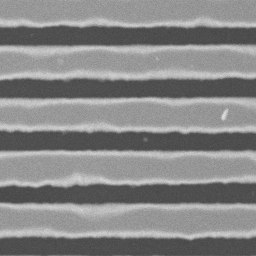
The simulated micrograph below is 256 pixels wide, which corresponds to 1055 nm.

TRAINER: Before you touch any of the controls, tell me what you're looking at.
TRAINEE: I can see lines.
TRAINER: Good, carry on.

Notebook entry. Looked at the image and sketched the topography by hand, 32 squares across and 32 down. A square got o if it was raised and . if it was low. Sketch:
oooooooooooooooooooooooooooooooo
oooooooooooooooooooooooooooooooo
oooooooooooooooooooooooooooooooo
................................
................................
................................
oooooooooooooooooooooooooooooooo
oooooooooooooooooooooooooooooooo
oooooooooooooooooooooooooooooooo
oooooooooooooooooooooooooooooooo
................................
................................
oooooooooooooooooooooooooooooooo
oooooooooooooooooooooooooooooooo
oooooooooooooooooooooooooooooooo
oooooooooooooooooooooooooooooooo
...................oo.oo.oooo.oo
................................
................................
oooooooooooooooooooooooooooooooo
oooooooooooooooooooooooooooooooo
oooooooooooooooooooooooooooooooo
oooooooooooooooooooooooooooooooo
................................
................................
oo.oo...................o.......
oooooooooooooooooooooooooooooooo
oooooooooooooooooooooooooooooooo
oooooooooooooooooooooooooooooooo
oooooooooooooooooooooooooooooooo
................................
................................